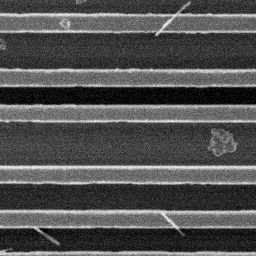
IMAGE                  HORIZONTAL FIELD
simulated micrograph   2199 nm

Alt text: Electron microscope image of lines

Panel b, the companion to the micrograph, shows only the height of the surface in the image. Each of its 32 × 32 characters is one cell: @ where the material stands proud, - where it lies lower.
--------------------------------
--------------------------------
@@@@@@@@@@@@@@@@@@@@@@@@@@@@@@@@
@@@@@@@@@@@@@@@@@@@@@@@@@@@@@@@@
--------------------------------
--------------------------------
--------------------------------
--------------------------------
--------------------------------
@@@@@@@@@@@@@@@@@@@@@@@@@@@@@@@@
@@@@@@@@@@@@@@@@@@@@@@@@@@@@@@@@
--------------------------------
--------------------------------
@@@@@@@@@@@@@@@@@@@@@@@@@@@@@@@@
@@@@@@@@@@@@@@@@@@@@@@@@@@@@@@@@
--------------------------------
--------------------------------
--------------------------------
--------------------------------
--------------------------------
--------------------------------
@@@@@@@@@@@@@@@@@@@@@@@@@@@@@@@@
@@@@@@@@@@@@@@@@@@@@@@@@@@@@@@@@
--------------------------------
--------------------------------
--------------------------------
@@@@@@@@@@@@@@@@@@@@@@@@@@@@@@@@
@@@@@@@@@@@@@@@@@@@@@@@@@@@@@@@@
----@@----------------@---------
--------------------------------
--------------------------------
@--@@@@-@@@@@@@@@@@@@----@@-----